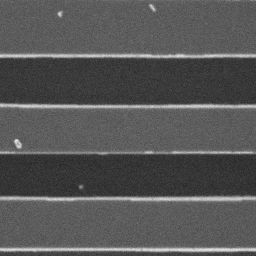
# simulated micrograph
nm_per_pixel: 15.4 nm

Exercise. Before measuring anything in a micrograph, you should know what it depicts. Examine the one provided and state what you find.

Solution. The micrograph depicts lines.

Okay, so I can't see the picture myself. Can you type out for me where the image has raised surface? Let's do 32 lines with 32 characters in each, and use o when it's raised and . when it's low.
oooooooooooooooooooooooooooooooo
oooooooooooooooooooooooooooooooo
oooooooooooooooooooooooooooooooo
oooooooooooooooooooooooooooooooo
oooooooooooooooooooooooooooooooo
oooooooooooooooooooooooooooooooo
oooooooooooooooooooooooooooooooo
................................
................................
................................
................................
................................
................................
oooooooooooooooooooooooooooooooo
oooooooooooooooooooooooooooooooo
oooooooooooooooooooooooooooooooo
oooooooooooooooooooooooooooooooo
oooooooooooooooooooooooooooooooo
oooooooooooooooooooooooooooooooo
................................
................................
................................
................................
................................
................................
oooooooooooooooooooooooooooooooo
oooooooooooooooooooooooooooooooo
oooooooooooooooooooooooooooooooo
oooooooooooooooooooooooooooooooo
oooooooooooooooooooooooooooooooo
oooooooooooooooooooooooooooooooo
................................